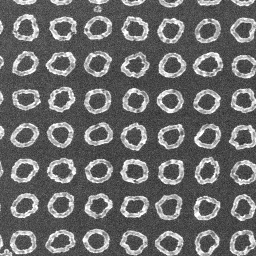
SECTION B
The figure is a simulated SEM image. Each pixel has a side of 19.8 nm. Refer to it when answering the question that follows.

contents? a regular array of ring-shaped raised bodies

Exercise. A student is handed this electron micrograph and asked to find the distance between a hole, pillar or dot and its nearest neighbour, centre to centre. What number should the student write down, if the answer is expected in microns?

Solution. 0.694